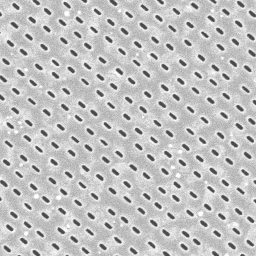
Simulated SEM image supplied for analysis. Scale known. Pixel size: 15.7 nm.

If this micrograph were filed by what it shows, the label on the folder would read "a regular array of holes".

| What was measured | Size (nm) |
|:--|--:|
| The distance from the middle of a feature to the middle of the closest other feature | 251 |